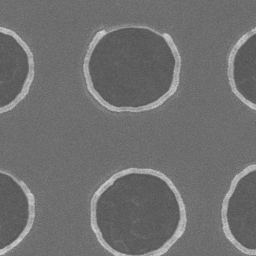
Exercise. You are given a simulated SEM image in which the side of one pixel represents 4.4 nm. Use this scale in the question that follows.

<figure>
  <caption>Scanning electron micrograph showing holes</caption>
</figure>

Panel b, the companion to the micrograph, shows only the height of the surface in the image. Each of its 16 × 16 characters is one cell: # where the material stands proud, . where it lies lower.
################
################
.#####....#####.
..####.....####.
..####.....####.
.#####.....####.
.######..#######
################
################
################
################
.######...#####.
..####.....###..
..####.....###..
.#####.....###..
#######...#####.